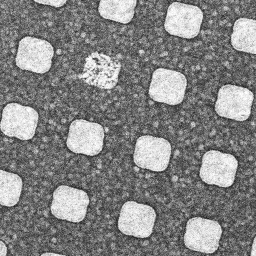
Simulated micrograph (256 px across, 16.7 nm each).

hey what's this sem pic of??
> a regular array of raised bodies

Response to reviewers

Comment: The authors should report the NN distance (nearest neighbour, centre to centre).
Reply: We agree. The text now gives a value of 1140 nanometres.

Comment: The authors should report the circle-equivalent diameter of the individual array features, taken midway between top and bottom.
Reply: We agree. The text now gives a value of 34.6 pixels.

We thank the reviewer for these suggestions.